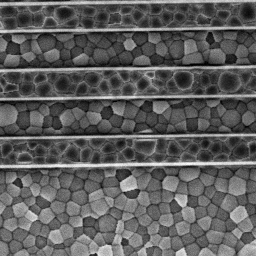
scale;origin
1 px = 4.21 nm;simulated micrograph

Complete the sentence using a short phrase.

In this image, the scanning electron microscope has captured one or a few lines or trenches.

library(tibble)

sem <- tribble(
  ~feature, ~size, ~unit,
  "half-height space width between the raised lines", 163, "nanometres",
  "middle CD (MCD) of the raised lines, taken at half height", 117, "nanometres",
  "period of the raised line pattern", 0.284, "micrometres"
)